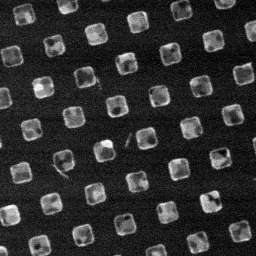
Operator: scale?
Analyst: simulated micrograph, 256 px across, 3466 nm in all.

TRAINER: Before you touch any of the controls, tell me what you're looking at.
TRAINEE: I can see a regular array of raised bodies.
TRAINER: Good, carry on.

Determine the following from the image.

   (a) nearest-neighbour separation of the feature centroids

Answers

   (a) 577 nm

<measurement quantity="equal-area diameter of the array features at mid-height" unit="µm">0.28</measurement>